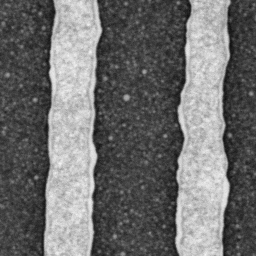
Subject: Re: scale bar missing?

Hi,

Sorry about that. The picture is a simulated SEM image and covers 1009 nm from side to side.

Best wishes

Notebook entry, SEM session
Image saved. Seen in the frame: one or a few lines or trenches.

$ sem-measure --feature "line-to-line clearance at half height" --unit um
0.351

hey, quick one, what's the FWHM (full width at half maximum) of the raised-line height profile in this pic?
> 172 nm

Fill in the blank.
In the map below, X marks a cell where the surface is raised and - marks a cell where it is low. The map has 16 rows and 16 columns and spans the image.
---XXX------XX--
---XXX------XX--
---XXX------XX--
---XXX------XX--
---XXX------XX--
---XXX------XX--
---XXX-----XXX--
---XXX-----XXX--
---XXX------XX--
---XXX-----XXX--
---XXX-----XXX--
---XXX-----XXX--
---XXX-----XXX--
---XXX-----XXX--
---XXX-----XXX--
---XXX-----XXX--